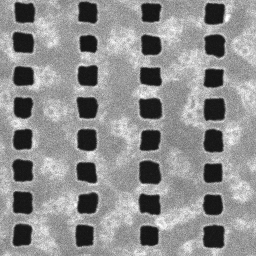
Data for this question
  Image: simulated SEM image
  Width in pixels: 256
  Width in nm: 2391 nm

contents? a regular array of holes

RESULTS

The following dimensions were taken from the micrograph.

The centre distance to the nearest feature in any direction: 31.4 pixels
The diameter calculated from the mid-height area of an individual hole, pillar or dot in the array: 207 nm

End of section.